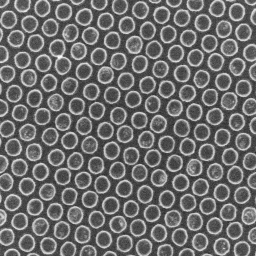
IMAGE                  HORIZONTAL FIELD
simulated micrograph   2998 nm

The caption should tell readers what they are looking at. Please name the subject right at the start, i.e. a regular array of raised bodies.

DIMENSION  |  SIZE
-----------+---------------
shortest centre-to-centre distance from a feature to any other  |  0.232 um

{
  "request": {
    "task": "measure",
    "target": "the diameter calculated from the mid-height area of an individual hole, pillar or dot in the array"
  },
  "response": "191 nm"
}